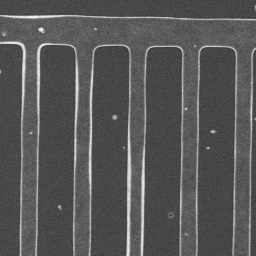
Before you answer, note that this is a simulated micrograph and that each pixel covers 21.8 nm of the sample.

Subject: groups of lines, slits or small figures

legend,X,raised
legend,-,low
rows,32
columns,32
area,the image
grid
--------------------------------
--------------------------------
XXXXXXXXXXXXXXXXXXXXXXXXXXXXXXXX
XXXXXXXXXXXXXXXXXXXXXXXXXXXXXXXX
XXXXXXXXXXXXXXXXXXXXXXXXXXXXXXXX
--XXXXXXXXXXXXXXXXXXXXXXXXXXXXXX
---XX----XXX----XX-----XX----XXX
---XX-----XX----XX-----XX-----XX
---XX-----XX----XX-----XX-----XX
---XX-----X-----XX-----XX-----XX
---XX-----X-----XX-----XX-----XX
---XX-----X-----XX-----XX-----XX
---XX-----X-----XX-----XX-----X-
---XX-----X-----XX-----XX-----X-
---XX-----X-----XX-----XX-----X-
---XX----XX-----XX-----XX----XX-
---XX----XX-----XX-----XX----XX-
---XX----XX-----XX-----XX----XX-
---XX----XX-----XX-----XX----XX-
---XX----XX-----XX-----XX----XX-
---XX----XX-----XX-----XX----XX-
---XX----XX-----XX-----XX----XX-
---XX----XX-----XX-----XX----XX-
---XX----XX-----XX-----XX----XX-
---XX----XX-----XX-----XX----XX-
---XX----XX-----XX-----XX----XX-
---XX----XX-----XX-----XX----XX-
---XX----XX-----XX-----XX----XX-
---XX----XX-----XX-----XX----XX-
---XX----XX-----XX----XXX----XX-
---XX----XX-----XX----XXX----XX-
---X-----XX-----XX----XXX----XX-